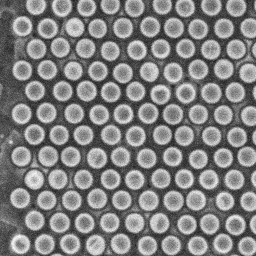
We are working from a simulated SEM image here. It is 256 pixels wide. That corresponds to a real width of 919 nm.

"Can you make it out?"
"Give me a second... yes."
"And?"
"a regular array of raised bodies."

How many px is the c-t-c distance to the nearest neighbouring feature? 23.6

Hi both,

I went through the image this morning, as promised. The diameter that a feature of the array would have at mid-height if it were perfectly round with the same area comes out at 67.8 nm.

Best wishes